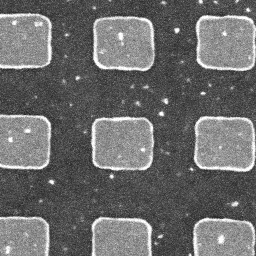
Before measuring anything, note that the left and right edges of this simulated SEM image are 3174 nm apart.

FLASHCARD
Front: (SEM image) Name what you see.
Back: raised bodies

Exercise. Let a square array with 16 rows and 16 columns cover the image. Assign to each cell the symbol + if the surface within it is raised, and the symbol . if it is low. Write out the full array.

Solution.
................
+++...+++...++++
+++...++++..++++
+++...++++..++++
................
................
................
+++...+++....++.
+++...++++..++++
+++...++++..++++
......+++....++.
................
................
................
+++...+++...++++
+++...+++...++++